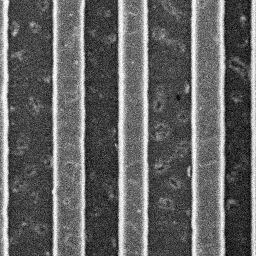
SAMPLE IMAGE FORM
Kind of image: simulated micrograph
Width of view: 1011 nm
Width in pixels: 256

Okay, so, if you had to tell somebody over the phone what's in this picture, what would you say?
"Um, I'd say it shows one or a few lines or trenches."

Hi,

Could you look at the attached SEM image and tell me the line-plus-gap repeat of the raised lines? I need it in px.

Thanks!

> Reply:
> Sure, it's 69.7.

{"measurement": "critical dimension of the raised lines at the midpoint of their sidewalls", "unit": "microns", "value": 0.116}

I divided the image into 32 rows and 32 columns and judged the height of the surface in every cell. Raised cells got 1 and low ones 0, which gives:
10000001110000011100000011110000
10000001110000011100000011110000
10000001110000011100000011110000
10000001110000011100000011110000
10000001110000011100000011110000
10000001110000011100000011110000
10000001110000011100000011110000
10000001110000011100000011110000
10000001110000011100000011110000
10000001110000011100000011110000
10000001110000011100000011110000
10000001110000011100000011110000
10000001110000011100000011110000
10000001110000011100000011110000
10000001110000011100000011110000
10000001110000011100000011110000
10000001110000011100000011110000
10000001110000011100000011110000
10000001110000011100000011110000
10000001110000011100000011110000
10000001110000011100000011110000
10000001110000011100000011110000
10000001111000011100000011110000
10000001110000011100000011110000
10000001110000011100000011110000
10000001110000011100000011110000
10000001110000011100000011110000
10000001110000011100000011110000
10000001110000011100000011110000
10000001110000011100000011110000
10000001111000011100000011110000
10000001110000011100000011110000